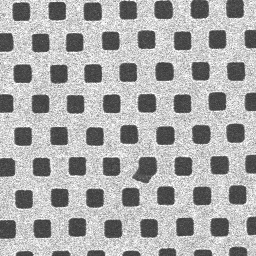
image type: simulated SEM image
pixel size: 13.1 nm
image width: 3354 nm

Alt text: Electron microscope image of a regular array of holes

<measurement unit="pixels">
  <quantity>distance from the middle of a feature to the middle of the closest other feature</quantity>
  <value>34.5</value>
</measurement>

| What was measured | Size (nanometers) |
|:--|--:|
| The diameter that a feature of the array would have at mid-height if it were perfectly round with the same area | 268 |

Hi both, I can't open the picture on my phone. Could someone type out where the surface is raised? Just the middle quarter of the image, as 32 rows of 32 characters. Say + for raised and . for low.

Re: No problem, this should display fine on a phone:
.++++....+++++....+++++....+++++
.++++.....++++....+++++.....++++
.++++.....++++....+++++.....++++
.++++.....++++....+++++....+++++
.++++....++++++..+++++++++++++++
++++++++++++++++++++++++++++++++
++++++++++++++++++++++++++++++++
+++++++++++..++++++...++++++...+
+....+++++....++++.....++++.....
+....++++.....++++.....++++.....
+....+++++....++++.....++++.....
+....+++++....+++++....++++.....
++..++++++++++++++++++++++++++++
++++++++++++++++++++++++++++++++
++++++++++++++++++++++++++++++++
+++++++++++++++...++++++...+++++
.+++++....++++.....++++.....++++
.++++.....++++.....++++.....++++
.++++.....++++.....++++.....++++
.++++.....++++....+++++.....++++
++++++...+++++++++++++++++++++++
++++++++++++++++++++++++++++++++
++++++++++++++++++++++++++++++++
+....+++++....+++++....+++++....
+.....+++.....++++.....++++.....
+.....+++.....++++.....++++.....
+.....++++....++++.....++++.....
+....+++++....+++......+++++....
+++++++++++++++++.....++++++++++
+++++++++++++++++++..+++++++++++
++++++++++++++++++++++++...+++++
.+++++....+++++....++++.....++++